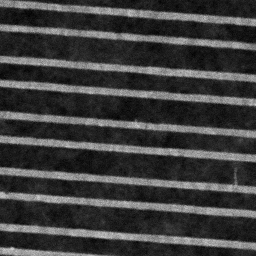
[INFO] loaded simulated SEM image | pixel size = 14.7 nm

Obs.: parallel lines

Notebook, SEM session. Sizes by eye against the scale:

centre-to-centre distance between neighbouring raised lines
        0.41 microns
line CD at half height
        91.5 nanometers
